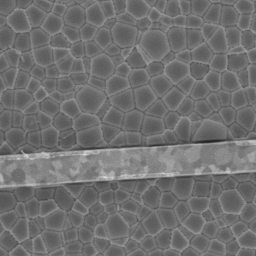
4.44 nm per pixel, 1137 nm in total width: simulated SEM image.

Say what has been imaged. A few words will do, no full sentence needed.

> one or a few lines or trenches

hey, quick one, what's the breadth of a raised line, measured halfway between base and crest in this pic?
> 0.134 um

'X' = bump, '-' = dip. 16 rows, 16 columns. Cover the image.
----------------
----------------
----------------
----------------
----------------
----------------
----------------
----------------
----------------
----XXXXXXXXXXXX
XXXXXXXXXXXXXXXX
XXX-------------
----------------
----------------
----------------
----------------